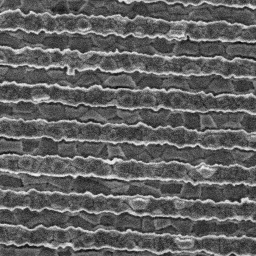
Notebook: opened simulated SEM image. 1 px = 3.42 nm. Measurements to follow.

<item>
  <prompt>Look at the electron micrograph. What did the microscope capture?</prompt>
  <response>parallel lines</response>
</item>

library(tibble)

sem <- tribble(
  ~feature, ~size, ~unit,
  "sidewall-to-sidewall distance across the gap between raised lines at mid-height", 58.9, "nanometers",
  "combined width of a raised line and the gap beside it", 122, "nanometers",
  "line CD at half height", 62.4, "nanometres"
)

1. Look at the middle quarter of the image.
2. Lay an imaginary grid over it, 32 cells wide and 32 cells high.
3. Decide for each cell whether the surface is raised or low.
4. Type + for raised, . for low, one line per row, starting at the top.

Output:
.+++++++++++++++++++++++++++++++
.++++..+.+++++++++++++++++++++++
.+.....................+....++++
................................
.............+..................
.......++.......................
++++++++++++.++++..++++++..++...
++++++++++++++++++++++++++++++++
++++++++++++++++++++++++++++++++
++++++++++++++++++++++++++++++++
.......++.+..+++++++++++++++++++
.......................+...+.+++
................................
................................
++++..+.........................
+++++++++++++++++++++...........
++++++++++++++++++++++++++++++++
++++++++++++++++++++++++++++++++
++++++++++++++++++++++++++++++++
............+++.++++++++++++++++
............................++..
................................
................................
++++++++........................
++++++++++++++++++++....+..++...
++++++++++++.+++++++++++++++++++
++++++++++++++++++++++++++++++++
++++++++++++++++++++++++++++++++
...........+++++++++++++++++++++
...............................+
................................
................................